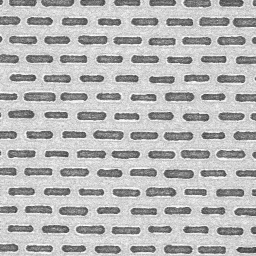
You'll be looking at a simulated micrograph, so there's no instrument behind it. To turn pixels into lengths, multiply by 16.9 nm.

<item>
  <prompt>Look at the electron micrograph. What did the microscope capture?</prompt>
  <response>a regular array of holes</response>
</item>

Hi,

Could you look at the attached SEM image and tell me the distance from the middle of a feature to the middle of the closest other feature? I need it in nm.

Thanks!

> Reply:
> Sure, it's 426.